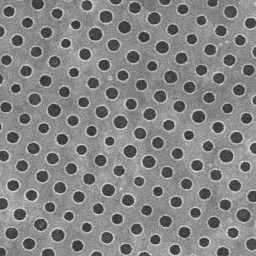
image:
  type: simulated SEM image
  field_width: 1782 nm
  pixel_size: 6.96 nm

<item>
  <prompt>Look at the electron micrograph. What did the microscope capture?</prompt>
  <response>a regular array of holes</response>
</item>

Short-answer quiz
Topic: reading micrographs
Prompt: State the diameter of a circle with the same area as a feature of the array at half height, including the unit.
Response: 84.1 nanometers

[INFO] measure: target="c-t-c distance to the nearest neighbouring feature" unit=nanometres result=146